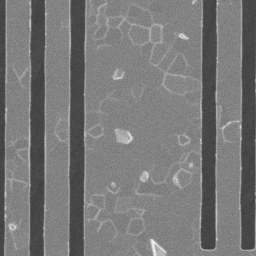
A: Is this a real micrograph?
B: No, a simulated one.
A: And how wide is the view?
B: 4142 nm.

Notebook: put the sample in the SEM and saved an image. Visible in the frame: groups of lines, slits or small figures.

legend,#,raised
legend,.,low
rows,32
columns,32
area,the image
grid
.###..###..##############..###..
.###..###..##############..###..
.###..###..##############..###..
.###..###..##############..###..
.###..###..##############..###..
.###..###..##############..###..
.###..###..##############..###..
.###..###..##############..###..
.###..###..##############..###..
.###..###..##############..###..
.###..###..##############..###..
.###..###..##############..###..
.###..###..##############..###..
.###..###..##############..###..
.###..###..##############..###..
.###..###..##############..###..
.###..###..##############..###..
.###..###..##############..###..
.###..###..##############..###..
.###..###..##############..###..
.###..###..##############..###..
.###..###..##############..###..
.###..###..##############..###..
.###..###..##############..###..
.###..###..##############..###..
.###..###..##############..###..
.###..###..##############..###..
.###..###..##############..###..
.###..###..##############..###..
.###..###..##############..###..
.###..###..##############..###..
.###..###..#####################